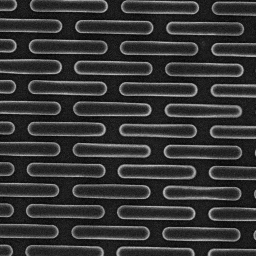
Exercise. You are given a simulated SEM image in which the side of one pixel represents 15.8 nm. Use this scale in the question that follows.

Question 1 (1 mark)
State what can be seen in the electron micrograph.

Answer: groups of lines, slits or small figures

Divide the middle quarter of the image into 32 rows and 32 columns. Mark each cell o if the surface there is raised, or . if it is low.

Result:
...ooooooooooooooooooo....oooooo
...ooooooooooooooooooo...ooooooo
...................oo.....oooooo
................................
................................
oooooooooo....oooooooooooooooooo
oooooooooo....oooooooooooooooooo
.ooooooooo.....ooooooooooooooooo
................................
................................
...oooooooooooooooooo.....oooooo
...oooooooooooooooooo.....oooooo
...oooooooooooooooooo.....oooooo
................................
................................
oooooooooo.....ooooooooooooooooo
oooooooooo....oooooooooooooooooo
ooooooooo......ooooooooooooooooo
................................
................................
...oooooooooooooooooo.....oooooo
..ooooooooooooooooooo....ooooooo
...oooooooooooooooooo....ooooooo
................................
................................
ooooooooo......o................
oooooooooo....oooooooooooooooooo
oooooooooo....oooooooooooooooooo
.....................ooooooooooo
................................
...oooooooooooooooo.............
..ooooooooooooooooooo....ooooooo